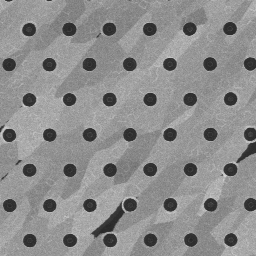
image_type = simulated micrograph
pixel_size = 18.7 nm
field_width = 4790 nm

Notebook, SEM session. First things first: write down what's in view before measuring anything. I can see a regular array of ring-shaped grooves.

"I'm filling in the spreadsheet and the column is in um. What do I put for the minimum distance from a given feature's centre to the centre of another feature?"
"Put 0.749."